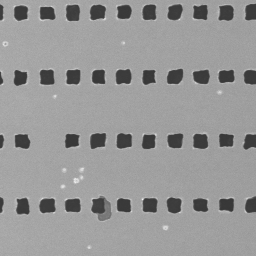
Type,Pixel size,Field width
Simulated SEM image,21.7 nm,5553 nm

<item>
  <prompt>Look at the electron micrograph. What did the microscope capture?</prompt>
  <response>a regular array of holes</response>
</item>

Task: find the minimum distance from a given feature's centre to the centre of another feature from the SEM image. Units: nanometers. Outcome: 546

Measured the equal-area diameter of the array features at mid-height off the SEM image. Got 337 nanometers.